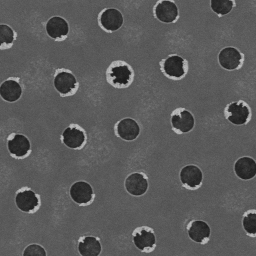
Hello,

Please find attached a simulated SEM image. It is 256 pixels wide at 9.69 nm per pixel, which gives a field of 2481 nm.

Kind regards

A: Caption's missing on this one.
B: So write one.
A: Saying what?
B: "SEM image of a regular array of holes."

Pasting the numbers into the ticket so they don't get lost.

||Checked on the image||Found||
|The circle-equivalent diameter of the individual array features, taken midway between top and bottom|206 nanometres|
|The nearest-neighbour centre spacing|535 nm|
